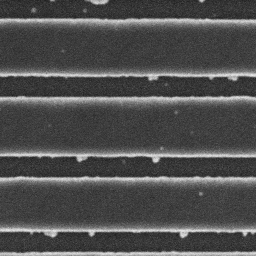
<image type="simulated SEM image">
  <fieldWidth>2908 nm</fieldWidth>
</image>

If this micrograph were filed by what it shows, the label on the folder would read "lines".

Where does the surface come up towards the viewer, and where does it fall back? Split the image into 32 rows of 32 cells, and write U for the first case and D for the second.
DDDDDDDDDDDDDDDDDDDDDDDDDDDDDDDD
DDDDDDDDDDDDDDDDDDDDDDDDDDDDDDDD
UUUDUUUDDDDDDDDDDDUDDDDDDDDDDDDD
UUUUUUUUUUUUUUUUUUUUUUUUUUUUUUUU
UUUUUUUUUUUUUUUUUUUUUUUUUUUUUUUU
UUUUUUUUUUUUUUUUUUUUUUUUUUUUUUUU
UUUUUUUUUUUUUUUUUUUUUUUUUUUUUUUU
UUUUUUUUUUUUUUUUUUUUUUUUUUUUUUUU
UUUUUUUUUUUUUUUUUUUUUUUUUUUUUUUU
DDDDDDDDDDDUUDDDDDDDDDDDUDUUDDDD
DDDDDDDDDDDDDDDDDDDDDDDDDDDDDDDD
DDDDDDDDDDDDDDDDDDDDDDDDDDDDDDDD
UUUUUUUUUUUUUUUUUUUUUUUUUUUUUUUU
UUUUUUUUUUUUUUUUUUUUUUUUUUUUUUUU
UUUUUUUUUUUUUUUUUUUUUUUUUUUUUUUU
UUUUUUUUUUUUUUUUUUUUUUUUUUUUUUUU
UUUUUUUUUUUUUUUUUUUUUUUUUUUUUUUU
UUUUUUUUUUUUUUUUUUUUUUUUUUUUUUUU
UUUUUUUUUUUUUUUUUUUUUUUUUUUUUUUU
DDDDDDDDDUUDDDDDDDDUDDUUUDDDUUUD
DDDDDDDDDDDDDDDDDDDDDDDDDDDDDDDD
DDDDDDDDDDDDDDDDDDDDDDDDDDDDDDDD
UUUUUUUUUUUUUUUUUUUUUUUUUUUUUUUU
UUUUUUUUUUUUUUUUUUUUUUUUUUUUUUUU
UUUUUUUUUUUUUUUUUUUUUUUUUUUUUUUU
UUUUUUUUUUUUUUUUUUUUUUUUUUUUUUUU
UUUUUUUUUUUUUUUUUUUUUUUUUUUUUUUU
UUUUUUUUUUUUUUUUUUUUUUUUUUUUUUUU
UUUUUUUUUUUUUUUUUUUUUUUUUUUUUUUU
DDDDDDDDDDDDDDDDDDDDDDDDDDDDDDDD
DDDDDDDDDDDDDDDDDDDDDDDDDDDDDDDD
DDDDDDDDDDDDDDDDDDDDDDDDDDDDDDDD